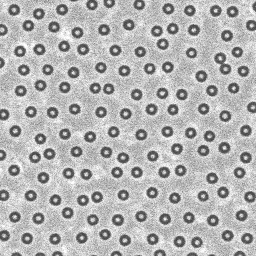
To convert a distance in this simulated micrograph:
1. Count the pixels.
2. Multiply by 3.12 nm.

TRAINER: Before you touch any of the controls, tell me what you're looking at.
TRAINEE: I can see a regular array of ring-shaped grooves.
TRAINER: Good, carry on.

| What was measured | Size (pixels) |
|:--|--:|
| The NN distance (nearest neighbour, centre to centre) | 19.4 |